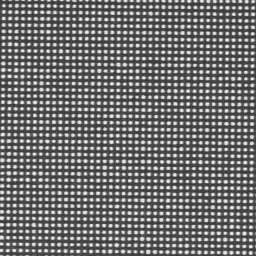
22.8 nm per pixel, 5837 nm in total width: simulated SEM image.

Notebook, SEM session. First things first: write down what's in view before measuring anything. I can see a regular array of raised bodies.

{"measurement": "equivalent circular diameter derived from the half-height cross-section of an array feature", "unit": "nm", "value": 72.8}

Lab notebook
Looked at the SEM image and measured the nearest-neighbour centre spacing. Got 137 nm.